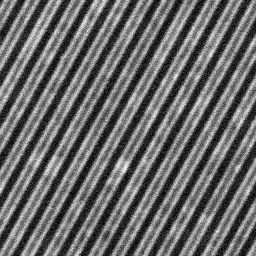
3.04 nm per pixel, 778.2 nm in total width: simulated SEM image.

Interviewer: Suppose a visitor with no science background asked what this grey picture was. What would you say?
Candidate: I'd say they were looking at parallel lines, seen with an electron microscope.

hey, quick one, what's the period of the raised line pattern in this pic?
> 60.1 nanometers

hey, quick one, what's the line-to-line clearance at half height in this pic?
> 0.0346 microns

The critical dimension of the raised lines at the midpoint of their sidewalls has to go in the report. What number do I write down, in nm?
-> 26.6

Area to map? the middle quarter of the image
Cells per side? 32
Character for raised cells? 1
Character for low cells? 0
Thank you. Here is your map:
10001110001110001100011100011100
10001100001100011100011000011000
00011100011100011000111000110000
00011000111000111000110001110001
00111000110000110001110001100011
00110001110001110001100011100011
01110001100011100011000011000111
01100011100011000011000111000110
11100011000111000110000110001110
11000111000110001110001110001100
10000110001110001100001100011100
10001110001100011100011000011000
00011100011100011000011000111000
00011000011000111000110001110001
00111000111000110001110001100001
00110000110001100001100011100011
01110001100001100011100011000011
01100011100011000011000111000110
11100011000111000111000110001110
11000111000110000110001110001100
10000110001110001100001100011100
10001110001100001100011100011000
10011100011100011000011000111000
00011100011000111000111000110001
00111000111000110001110001110001
00110000110001110001100001100011
01110001100001100011100011000011
01100011100011100011000111000111
11100011000011000111000110001110
11000111000111000110001110001110
11000110000110001110001100011100
10001110001100001100011100011000